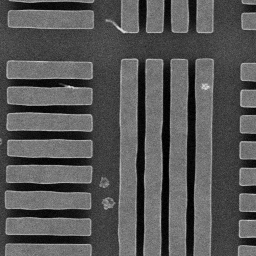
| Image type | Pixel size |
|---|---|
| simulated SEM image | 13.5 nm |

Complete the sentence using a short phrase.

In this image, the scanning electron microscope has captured groups of lines, slits or small figures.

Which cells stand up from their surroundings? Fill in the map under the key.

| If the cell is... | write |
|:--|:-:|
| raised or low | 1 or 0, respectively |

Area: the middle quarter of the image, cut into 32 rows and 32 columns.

11111110000000111100011110011110
11111110000000111100011110011110
11111110000000111100011110011110
11111110000000111100011110011110
00000000000000111100011110011110
00000000000000111100011110011110
11111110000000111100011110011110
11111110000000111100011110011110
11111110000000111100011110011110
11111110000000111100011110011110
00000000000000111100011110011110
00000000000000111100011110011110
00000000000000111100011110011110
11111110000000111100011110011110
11111110000000111100011110011110
11111110000000111100011110011110
11111110000000111100011100011110
00000000000000111100111100011110
00000000000000111100111100011110
11111110000000111100111100011110
11111110000000111100111100111100
11111110000000111100111100111100
11111110000000111100111110111100
00000000000000111100111110111100
00000000000000111100111110111100
00000000000000111100111110111100
11111110000000111100111110111100
11111110000000111100111110111100
11111110000000111100111110111100
11111110000000111100111100111100
00000000000000111100111100111110
00000000000000111100111100111110